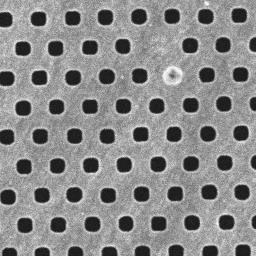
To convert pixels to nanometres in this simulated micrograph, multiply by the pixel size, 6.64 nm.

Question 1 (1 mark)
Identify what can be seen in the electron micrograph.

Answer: a regular array of holes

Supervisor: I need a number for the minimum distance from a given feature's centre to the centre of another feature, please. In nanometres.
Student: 220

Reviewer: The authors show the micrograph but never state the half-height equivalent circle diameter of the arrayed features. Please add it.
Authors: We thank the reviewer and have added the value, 110 nm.